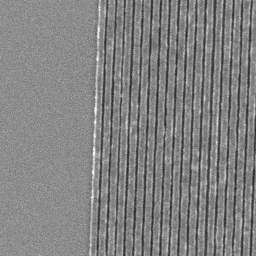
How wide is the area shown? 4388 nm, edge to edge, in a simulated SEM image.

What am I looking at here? parallel lines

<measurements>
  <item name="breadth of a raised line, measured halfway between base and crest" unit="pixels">6.24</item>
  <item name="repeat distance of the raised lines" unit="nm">154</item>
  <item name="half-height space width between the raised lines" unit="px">2.75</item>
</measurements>